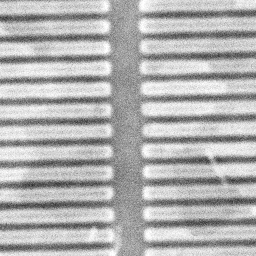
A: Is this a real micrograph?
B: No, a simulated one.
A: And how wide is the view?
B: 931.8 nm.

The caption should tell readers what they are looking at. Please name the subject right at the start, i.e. groups of lines, slits or small figures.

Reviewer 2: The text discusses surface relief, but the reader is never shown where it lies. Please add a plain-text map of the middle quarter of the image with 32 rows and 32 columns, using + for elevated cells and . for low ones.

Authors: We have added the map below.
+++++++++++.........++++++++++++
+++++++++++.........++++++++++++
................................
................................
................................
+++++++++++.........++++++++++++
+++++++++++.........++++++++++++
+++++++++++.....................
................................
................................
+++++++++++.........++++++++++++
+++++++++++.........++++++++++++
+++++++++++.....................
................................
................................
......................+++...++++
++++++++++++........++++++++++++
+++++++++++..........++++..++++.
................................
................................
.......................+++++++++
++++++++++++........++++++++++++
++++++++++++........++++++++++++
....++..........................
................................
............................++++
++++++++++++........++++++++++++
++++++++++++........++++++++++++
+++++++++++.....................
................................
................................
.+++++++++++........++++++++++++